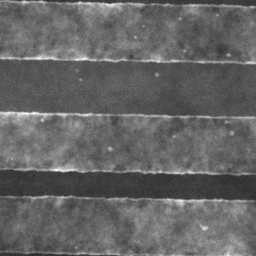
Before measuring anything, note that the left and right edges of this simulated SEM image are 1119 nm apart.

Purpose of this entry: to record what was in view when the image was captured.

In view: lines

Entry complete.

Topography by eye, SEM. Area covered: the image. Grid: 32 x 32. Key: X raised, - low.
XXXXXXXXXXXXXXXXXXXXX-----------
XXXXXXXXXXXXXXXXXXXXXXXXXXXXXXXX
XXXXXXXXXXXXXXXXXXXXXXXXXXXXXXXX
XXXXXXXXXXXXXXXXXXXXXXXXXXXXXXXX
XXXXXXXXXXXXXXXXXXXXXXXXXXXXXXXX
XXXXXXXXXXXXXXXXXXXXXXXXXXXXXXXX
XXXXXXXXXXXXXXXXXXXXXXXXXXXXXXXX
-----------XXXXXXXXXXXXXXXXXXXXX
--------------------------------
--------------------------------
--------------------------------
--------------------------------
--------------------------------
--------------------------------
XXXXXXXXXXXXXXXXXXXXX--X--------
XXXXXXXXXXXXXXXXXXXXXXXXXXXXXXXX
XXXXXXXXXXXXXXXXXXXXXXXXXXXXXXXX
XXXXXXXXXXXXXXXXXXXXXXXXXXXXXXXX
XXXXXXXXXXXXXXXXXXXXXXXXXXXXXXXX
XXXXXXXXXXXXXXXXXXXXXXXXXXXXXXXX
XXXXXXXXXXXXXXXXXXXXXXXXXXXXXXXX
----------X---XX-XXXXXXXXXXXXXXX
--------------------------------
--------------------------------
-----XX-------------------------
XXXXXXXXXXXXXXXXXXXXXXXXXXXXXXXX
XXXXXXXXXXXXXXXXXXXXXXXXXXXXXXXX
XXXXXXXXXXXXXXXXXXXXXXXXXXXXXXXX
XXXXXXXXXXXXXXXXXXXXXXXXXXXXXXXX
XXXXXXXXXXXXXXXXXXXXXXXXXXXXXXXX
XXXXXXXXXXXXXXXXXXXXXXXXXXXXXXXX
XXXXXXXXXXXXXXXXXXXXXXXXXXXXXXXX